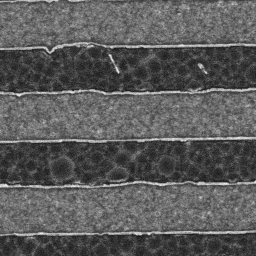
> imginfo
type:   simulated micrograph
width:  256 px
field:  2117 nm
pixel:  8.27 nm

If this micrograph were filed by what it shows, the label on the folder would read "one or a few lines or trenches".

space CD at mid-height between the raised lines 382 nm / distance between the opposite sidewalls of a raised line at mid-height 374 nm